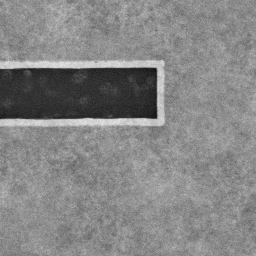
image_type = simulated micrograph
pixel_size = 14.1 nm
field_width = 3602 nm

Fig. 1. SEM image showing one or a few lines or trenches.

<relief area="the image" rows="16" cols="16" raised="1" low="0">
1111111111111111
1111111111111111
1111111111111111
1111111111111111
0000000000111111
0000000000111111
0000000000111111
0000000000111111
1111111111111111
1111111111111111
1111111111111111
1111111111111111
1111111111111111
1111111111111111
1111111111111111
1111111111111111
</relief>